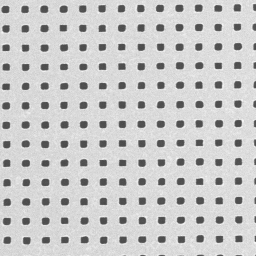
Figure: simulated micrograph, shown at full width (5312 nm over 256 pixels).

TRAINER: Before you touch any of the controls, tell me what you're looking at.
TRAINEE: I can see a regular array of holes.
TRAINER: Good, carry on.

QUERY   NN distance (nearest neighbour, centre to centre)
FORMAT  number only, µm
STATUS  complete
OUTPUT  0.394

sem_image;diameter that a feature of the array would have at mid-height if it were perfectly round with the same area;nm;174